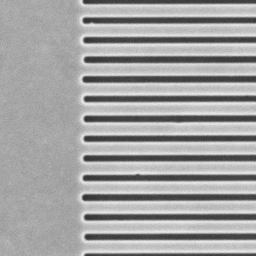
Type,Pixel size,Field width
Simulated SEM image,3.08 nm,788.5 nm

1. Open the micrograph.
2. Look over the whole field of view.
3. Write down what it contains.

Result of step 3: parallel lines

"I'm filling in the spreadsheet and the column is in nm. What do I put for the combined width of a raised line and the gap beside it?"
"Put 60.6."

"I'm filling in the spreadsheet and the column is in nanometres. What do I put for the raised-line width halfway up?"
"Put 36.2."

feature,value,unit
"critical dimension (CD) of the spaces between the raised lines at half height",7.89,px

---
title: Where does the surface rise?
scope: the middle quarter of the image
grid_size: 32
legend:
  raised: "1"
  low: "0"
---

11111111111111111111111111111111
11111111111111111111111111111111
11111111111111111111111111111111
11110000000000000000000000000000
11111000000000000000000000000000
11111111111111111111111111111111
11111111111111111111111111111111
11111111111111111111111111111111
11111000000000000000000000000000
11111000000000000000000000000000
11111111111111111111111111111111
11111111111111111111111111111111
11111111111100000000000000000000
11111000000000000000000000000000
11111000000000000000000000000000
11111111111111111111111111111111
11111111111111111111111111111111
11111111111111111111111111111111
11111000000000000000000000000000
11111000000000000000000000000000
11111111111111111111111111111111
11111111111111111111111111111111
11111000000000000000000000000000
11110000000000000000000000000000
11111000000000000000000000000000
11111111111111111111111111111111
11111111111111111111111111111111
11111000000000000000000000000000
11110000000000000000000000000000
11111000000000000000000000000000
11111111111111111111111111111111
11111111111111111111111111111111